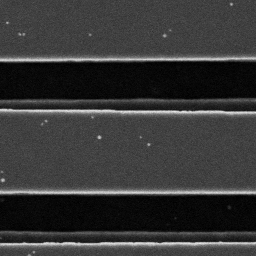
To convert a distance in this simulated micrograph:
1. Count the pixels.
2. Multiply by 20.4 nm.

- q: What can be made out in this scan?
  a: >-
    lines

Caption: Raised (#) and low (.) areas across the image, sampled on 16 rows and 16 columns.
################
################
################
################
................
................
################
################
################
################
################
################
................
................
................
################